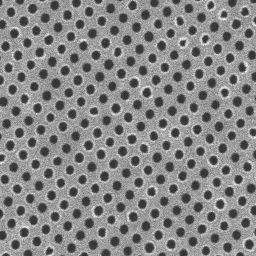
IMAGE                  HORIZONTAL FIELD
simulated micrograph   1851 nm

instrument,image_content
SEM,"a regular array of holes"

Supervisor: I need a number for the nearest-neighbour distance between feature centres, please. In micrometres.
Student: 0.111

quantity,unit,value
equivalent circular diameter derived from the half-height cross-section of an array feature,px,9.24